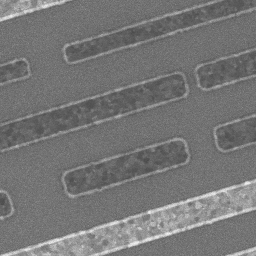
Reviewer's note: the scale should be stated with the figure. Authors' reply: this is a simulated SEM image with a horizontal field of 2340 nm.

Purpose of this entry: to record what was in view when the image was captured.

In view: one or a few lines or trenches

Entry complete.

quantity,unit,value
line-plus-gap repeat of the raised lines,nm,569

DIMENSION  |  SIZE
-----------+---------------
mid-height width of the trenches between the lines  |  349 nanometres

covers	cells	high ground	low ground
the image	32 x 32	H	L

HHHHHHHLLLLLLLLLLLLLLLLLLLHHHHHH
HHHLLLLLLLLLLLLLLLLLLLHHHHHHHHHL
LLLLLLLLLLLLLLLLLLLHHHHHHHHLLLLL
LLLLLLLLLLLLLLLLHHHHHHHHLLLLLLLL
LLLLLLLLLLLLHHHHHHHHLLLLLLLLLLLL
LLLLLLLLLHHHHHHHHLLLLLLLLLLLLLLL
LLLLLLLLHHHHHHLLLLLLLLLLLLLLLLLH
LLHLLLLLHHLLLLLLLLLLLLLLLLLHHHHH
HHHHLLLLLLLLLLLLLLLLLLLLLHHHHHHH
HHHLLLLLLLLLLLLLLLLLLHHLLHHHHHHH
LLLLLLLLLLLLLLLLLHHHHHHLLHHHLLLL
LLLLLLLLLLLLLLHHHHHHHHHLLLLLLLLL
LLLLLLLLLLLHHHHHHHHHHHLLLLLLLLLL
LLLLLLLHHHHHHHHHHHLLLLLLLLLLLLLL
LLLLHHHHHHHHHHHLLLLLLLLLLLLLLLLL
LHHHHHHHHHHHLLLLLLLLLLLLLLLLHHHH
HHHHHHHHLLLLLLLLLLLLLLLLLLLHHHHH
HHHHHLLLLLLLLLLLLLLLLLHLLLLHHHHH
HHLLLLLLLLLLLLLLLLHHHHHLLLLHHHLL
LLLLLLLLLLLLLLLHHHHHHHHHLLLLLLLL
LLLLLLLLLLLHHHHHHHHHHHHLLLLLLLLL
LLLLLLLLHHHHHHHHHHHHLLLLLLLLLLLL
LLLLLLLLHHHHHHHHLLLLLLLLLLLLLLLL
LLLLLLLLHHHHHLLLLLLLLLLLLLLLLHHH
HLLLLLLLLLLLLLLLLLLLLLLLLLHHHHHH
HLLLLLLLLLLLLLLLLLLLLLHHHHHHHHHH
HLLLLLLLLLLLLLLLLLLHHHHHHHHHHHLL
LLLLLLLLLLLLLLLLHHHHHHHHHHHLLLLL
LLLLLLLLLLLLHHHHHHHHHHHLLLLLLLLL
LLLLLLLLLHHHHHHHHHHHLLLLLLLLLLLL
LLLLLLHHHHHHHHHHHLLLLLLLLLLLLLLL
LLHHHHHHHHHHHLLLLLLLLLLLLLLLLLLH